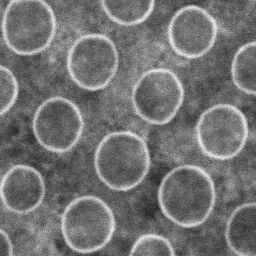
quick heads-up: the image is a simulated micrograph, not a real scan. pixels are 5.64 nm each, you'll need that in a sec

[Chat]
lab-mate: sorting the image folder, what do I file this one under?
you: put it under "a regular array of raised bodies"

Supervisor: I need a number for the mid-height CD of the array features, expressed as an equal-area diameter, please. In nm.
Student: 285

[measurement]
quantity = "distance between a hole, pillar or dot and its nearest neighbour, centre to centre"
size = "411 nanometres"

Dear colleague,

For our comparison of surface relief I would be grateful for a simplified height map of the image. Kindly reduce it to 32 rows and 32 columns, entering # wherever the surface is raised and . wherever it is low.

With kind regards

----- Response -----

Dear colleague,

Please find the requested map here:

.#####.......######.............
.#####.......######...####......
.######.......####....#####.....
#######..............######.....
.######..............######.....
.#####...#####........####.....#
..##.....#####........####....##
.........######..............###
.........#####...............###
##.......#####....####.......###
##........###....#####........##
##...............######........#
##....##.........######.........
#....####........#####.....##...
....######........####...#####..
....######...............######.
....######...............######.
.....#####...#####.......######.
......###...######.......#####..
............######.........##...
............######..............
.####.......######...####.......
#####........#####...#####......
#####.........##....#######.....
#####...............#######.....
.####....####.......#######.....
..#.....######.......#####...###
........######........###....###
........######..............####
#.......######..............####
#........####....####........###
#...............######........##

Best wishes